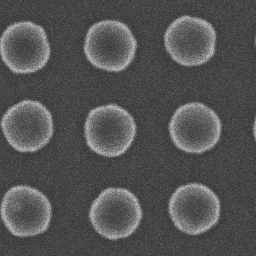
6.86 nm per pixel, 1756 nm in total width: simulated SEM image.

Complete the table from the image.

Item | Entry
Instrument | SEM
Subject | a regular array of raised bodies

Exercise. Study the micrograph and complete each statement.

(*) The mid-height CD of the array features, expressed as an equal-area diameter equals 333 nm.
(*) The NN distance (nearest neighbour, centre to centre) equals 553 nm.